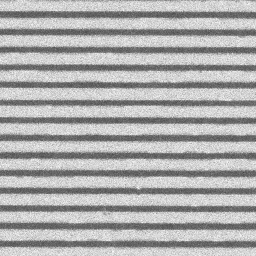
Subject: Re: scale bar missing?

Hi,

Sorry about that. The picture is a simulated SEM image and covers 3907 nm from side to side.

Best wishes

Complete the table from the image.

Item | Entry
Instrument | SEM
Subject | parallel lines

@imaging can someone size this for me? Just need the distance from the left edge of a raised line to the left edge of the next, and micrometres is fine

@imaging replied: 0.269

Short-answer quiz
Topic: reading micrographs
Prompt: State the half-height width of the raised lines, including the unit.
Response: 124 nanometers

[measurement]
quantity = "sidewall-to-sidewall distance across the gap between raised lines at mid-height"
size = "9.63 pixels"